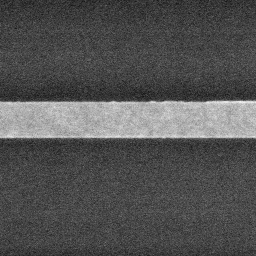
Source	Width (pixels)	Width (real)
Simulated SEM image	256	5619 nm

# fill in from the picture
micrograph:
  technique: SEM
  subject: lines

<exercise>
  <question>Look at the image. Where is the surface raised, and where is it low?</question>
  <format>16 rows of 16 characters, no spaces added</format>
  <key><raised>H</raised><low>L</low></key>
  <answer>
LLLLLLLLLLLLLLLL
LLLLLLLLLLLLLLLL
LLLLLLLLLLLLLLLL
LLLLLLLLLLLLLLLL
LLLLLLLLLLLLLLLL
LLLLLLLLLLLLLLLL
HHHHHHHHHHHHHHHH
HHHHHHHHHHHHHHHH
HHHHHHHHHHHHHHHH
LLLLLLLLLLLLLLLL
LLLLLLLLLLLLLLLL
LLLLLLLLLLLLLLLL
LLLLLLLLLLLLLLLL
LLLLLLLLLLLLLLLL
LLLLLLLLLLLLLLLL
LLLLLLLLLLLLLLLL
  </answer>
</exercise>